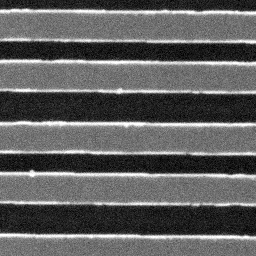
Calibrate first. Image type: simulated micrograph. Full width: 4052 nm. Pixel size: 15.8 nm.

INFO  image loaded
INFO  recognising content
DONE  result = lines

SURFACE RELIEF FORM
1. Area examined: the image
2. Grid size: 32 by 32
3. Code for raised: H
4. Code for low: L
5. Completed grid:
LLLLLLLLLLLLLLLLLLLLLLLLLLLLLLLL
HHHHHHHHHHHHHHHHHHHHHHHHLHHHHLLL
HHHHHHHHHHHHHHHHHHHHHHHHHHHHHHHH
HHHHHHHHHHHHHHHHHHHHHHHHHHHHHHHH
HHHHHHHHHHHHHHHHHHHHHHHHHHHHHHHH
LLLLLLLLLLLLLLLLLLLLLLLLLLLLLLLL
LLLLLLLLLLLLLLLLLLLLLLLLLLLLLLLL
LLLLLLLLLLLLLLLLLLLLLLLLLLLLLLLL
HHHHHHHHHHHHHHHHHHHHHHHHHHHHHHHH
HHHHHHHHHHHHHHHHHHHHHHHHHHHHHHHH
HHHHHHHHHHHHHHHHHHHHHHHHHHHHHHHH
LLLLLLLLLLLLLLHHLLLLLLLLHHHHHHHH
LLLLLLLLLLLLLLLLLLLLLLLLLLLLLLLL
LLLLLLLLLLLLLLLLLLLLLLLLLLLLLLLL
LLLLLLLLLLLLLLLLLLLLLLLLLLLLLLLL
HHHHHHHHHHHHHHHHHHLLLLLLLLLLLLLL
HHHHHHHHHHHHHHHHHHHHHHHHHHHHHHHH
HHHHHHHHHHHHHHHHHHHHHHHHHHHHHHHH
HHHHHHHHHHHHHHHHHHHHHHHHHHHHHHHH
LLLLLLLLLLLLLLLLLLLLLLLLLLLLLLLL
LLLLLLLLLLLLLLLLLLLLLLLLLLLLLLLL
LLLLLLLLLLLLLLLLLLLLLLLLLLLLLLLL
HHHHHHHHHHHHHHHHHHHHHHHHHHHHHHHH
HHHHHHHHHHHHHHHHHHHHHHHHHHHHHHHH
HHHHHHHHHHHHHHHHHHHHHHHHHHHHHHHH
LLLLLLLLLLLLHHHHHHHHHHHHHHHHHHHH
LLLLLLLLLLLLLLLLLLLLLLLLLLLLLLLL
LLLLLLLLLLLLLLLLLLLLLLLLLLLLLLLL
LLLLLLLLLLLLLLLLLLLLLLLLLLLLLLLL
HHHHHHHHHHHHHHHHHHLLLLLLLLLLLLLL
HHHHHHHHHHHHHHHHHHHHHHHHHHHHHHHH
HHHHHHHHHHHHHHHHHHHHHHHHHHHHHHHH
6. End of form